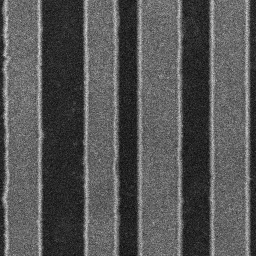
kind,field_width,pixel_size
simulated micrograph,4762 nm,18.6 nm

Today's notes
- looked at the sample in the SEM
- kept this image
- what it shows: one or a few lines or trenches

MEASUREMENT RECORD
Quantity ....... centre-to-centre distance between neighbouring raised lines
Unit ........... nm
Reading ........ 1280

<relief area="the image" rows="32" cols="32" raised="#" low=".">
.####......###....####.....####.
.####......###....####.....####.
.####......###....####.....####.
.####......###....####.....####.
.####......###....####.....####.
.####......###....####.....####.
.####......###....####.....####.
.####......###....####.....####.
.####......###....####.....####.
.####......###....####.....####.
.####......###....####.....####.
.####......###....####.....####.
.####......###....####.....####.
.####......###....####.....####.
.####......###....####.....####.
.####......###....####.....####.
.####......###....####.....####.
.####......###....####.....####.
.####......###....####.....####.
.####......###....####.....####.
.####......###....####.....####.
.####......###....####.....####.
.####......###....####.....####.
.####......###....####.....####.
.####......###....####....#####.
.####......###....####.....####.
.####......###....####.....####.
.####......###....####.....####.
.####......###....####.....####.
.####......###....####.....####.
.####......###....####.....####.
.####......###....####.....####.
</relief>